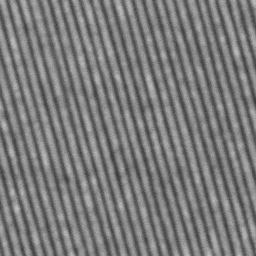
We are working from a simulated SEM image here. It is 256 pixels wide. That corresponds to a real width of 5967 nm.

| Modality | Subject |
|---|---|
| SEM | parallel lines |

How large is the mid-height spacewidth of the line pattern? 84.4 nm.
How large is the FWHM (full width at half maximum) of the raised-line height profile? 146 nanometres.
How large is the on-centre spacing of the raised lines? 236 nm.